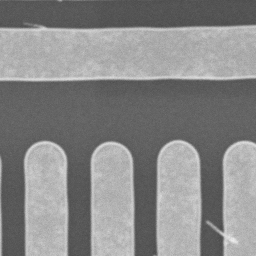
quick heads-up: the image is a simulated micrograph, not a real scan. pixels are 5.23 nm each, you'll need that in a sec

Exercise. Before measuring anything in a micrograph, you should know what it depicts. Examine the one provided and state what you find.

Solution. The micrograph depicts groups of lines, slits or small figures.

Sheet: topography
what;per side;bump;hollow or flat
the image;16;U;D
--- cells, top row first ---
DDDDDDDDDDDDDDDD
DDDDDDDDDDDDDDDD
UUUUUUUUUUUUUUUU
UUUUUUUUUUUUUUUU
UUUUUUUUUUUUUUUU
DDDDDDDDDDDDDDDD
DDDDDDDDDDDDDDDD
DDDDDDDDDDDDDDDD
DDDDDDDDDDDDDDDD
DDUUDDUUDDUUDDUU
DDUUDDUUDDUUDDUU
DDUUDDUUDDUUDDUU
DDUUDDUUDDUUDDUU
DDUUDDUUDDUUDDUU
DDUUDDUUDDUUDDUU
DDUUDDUUDDUUDDUU